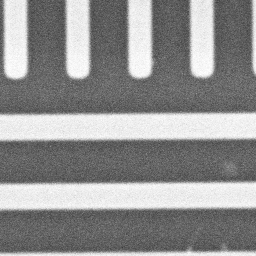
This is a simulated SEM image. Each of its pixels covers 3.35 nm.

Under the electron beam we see groups of lines, slits or small figures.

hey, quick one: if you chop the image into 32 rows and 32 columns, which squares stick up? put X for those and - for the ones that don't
-XX-----XXX-----XXX-----XXX-----
-XX-----XXX-----XXX-----XXX-----
-XX-----XXX-----XXX-----XXX-----
-XX-----XXX-----XXX-----XXX-----
-XX-----XXX-----XXX-----XXX-----
-XX-----XXX-----XXX-----XXX-----
-XX-----XXX-----XXX-----XXX-----
-XX-----XXX-----XXX-----XXX-----
-XX-----XXX-----XXX-----XXX-----
-XX------XX------X-------X------
--------------------------------
--------------------------------
--------------------------------
--------------------------------
XXXXXXXXXXXXXXXXXXXXXXXXXXXXXXXX
XXXXXXXXXXXXXXXXXXXXXXXXXXXXXXXX
XXXXXXXXXXXXXXXXXXXXXXXXXXXXXXXX
--------------------------------
--------------------------------
--------------------------------
--------------------------------
--------------------------------
--------------------------------
XXXXXXXXXXXXXXXXXXXXXXXXXXXXXXXX
XXXXXXXXXXXXXXXXXXXXXXXXXXXXXXXX
XXXXXXXXXXXXXXXXXXXXXXXXXXXXXXXX
--------------------------------
--------------------------------
--------------------------------
--------------------------------
--------------------------------
--------------------------------